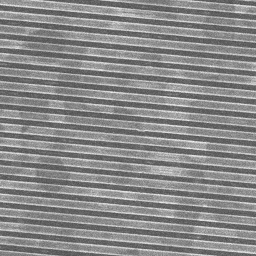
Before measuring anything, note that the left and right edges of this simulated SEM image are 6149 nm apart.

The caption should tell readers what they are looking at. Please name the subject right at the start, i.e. parallel lines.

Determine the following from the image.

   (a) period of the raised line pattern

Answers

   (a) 14 pixels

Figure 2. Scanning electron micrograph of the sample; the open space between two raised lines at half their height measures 146 nanometers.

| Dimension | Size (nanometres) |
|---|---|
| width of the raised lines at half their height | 188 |